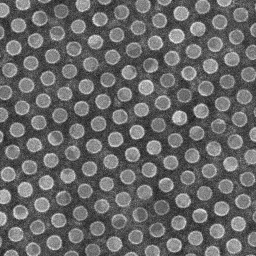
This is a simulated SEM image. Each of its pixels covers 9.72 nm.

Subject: a regular array of raised bodies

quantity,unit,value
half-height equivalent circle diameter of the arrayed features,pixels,14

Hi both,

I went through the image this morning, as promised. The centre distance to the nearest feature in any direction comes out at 218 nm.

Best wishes